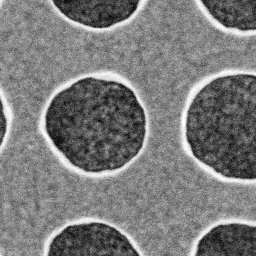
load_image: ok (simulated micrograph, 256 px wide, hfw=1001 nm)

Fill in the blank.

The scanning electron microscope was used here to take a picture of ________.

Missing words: holes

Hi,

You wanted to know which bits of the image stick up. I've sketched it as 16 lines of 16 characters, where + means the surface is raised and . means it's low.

++++.....++++...
+++++..+++++++..
++++++++++++++++
++++++++++++++++
++++++++++++++++
++++....++++....
+++......+++....
+++......+++....
+++......+++....
++++.....+++....
+++++...+++++...
++++++++++++++++
++++++++++++++++
++++++++++++++++
++++...++++++...
+++.....++++....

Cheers